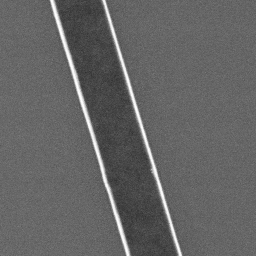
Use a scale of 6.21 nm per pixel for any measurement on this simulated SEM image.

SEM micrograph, one or a few lines or trenches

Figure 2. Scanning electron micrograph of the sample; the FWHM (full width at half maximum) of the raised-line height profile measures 317 nm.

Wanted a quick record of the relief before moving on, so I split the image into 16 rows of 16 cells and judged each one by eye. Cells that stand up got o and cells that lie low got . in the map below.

...oooo.........
....ooo.........
....ooo.........
....oooo........
.....ooo........
.....ooo........
.....ooo........
.....oooo.......
......ooo.......
......ooo.......
......oooo......
.......ooo......
.......ooo......
.......oooo.....
........ooo.....
........ooo.....